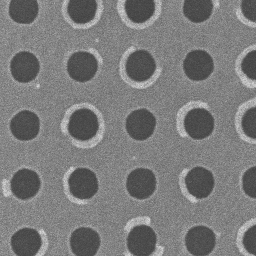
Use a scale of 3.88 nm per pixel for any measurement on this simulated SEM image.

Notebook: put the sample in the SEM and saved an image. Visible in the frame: a regular array of holes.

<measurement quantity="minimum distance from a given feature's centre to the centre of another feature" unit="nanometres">224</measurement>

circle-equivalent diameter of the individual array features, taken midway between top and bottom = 121 nm